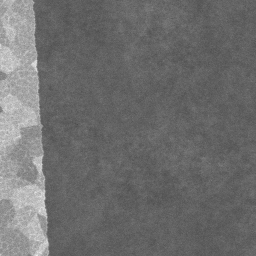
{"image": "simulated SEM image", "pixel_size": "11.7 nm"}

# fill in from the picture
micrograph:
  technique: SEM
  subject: one or a few lines or trenches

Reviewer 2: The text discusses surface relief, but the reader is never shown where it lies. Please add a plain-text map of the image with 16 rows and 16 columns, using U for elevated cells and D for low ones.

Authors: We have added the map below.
UUDDDDDDDDDDDDDD
UUDDDDDDDDDDDDDD
UUDDDDDDDDDDDDDD
UUDDDDDDDDDDDDDD
UUDDDDDDDDDDDDDD
UUDDDDDDDDDDDDDD
UUDDDDDDDDDDDDDD
UUDDDDDDDDDDDDDD
UUDDDDDDDDDDDDDD
UUUDDDDDDDDDDDDD
UUUDDDDDDDDDDDDD
UUUDDDDDDDDDDDDD
UUUDDDDDDDDDDDDD
UUUDDDDDDDDDDDDD
UUUDDDDDDDDDDDDD
UUUDDDDDDDDDDDDD